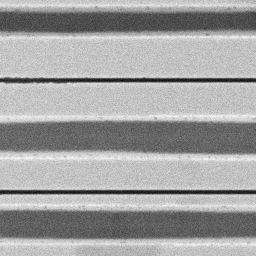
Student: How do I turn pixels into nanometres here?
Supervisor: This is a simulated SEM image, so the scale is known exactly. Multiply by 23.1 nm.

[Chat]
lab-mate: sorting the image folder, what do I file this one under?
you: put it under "lines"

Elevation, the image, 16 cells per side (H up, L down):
LLLLLLLLLLLLLLLL
LLLLLLLLLLLLLLLL
HHHHHHHHHHHHHHHH
HHHHHHHHHHHHHHHH
HHHHHHHHHHHHHHHH
HHHHHHHHHHHHHHHH
HHHHHHHHHHHHHHHH
LLLLLLLLLLLLLLLL
LLLLLLLLLLLLLLLL
LLLLLLLLLLLLLLLL
HHHHHHHHHHHHHHHH
HHHHHHHHHHHHHHHH
HHHHHHHHHHHHHHHH
LLLLLLLLLLLLLLLL
LLLLLLLLLLLLLLLL
HHHHHHHHHHHHHHHH